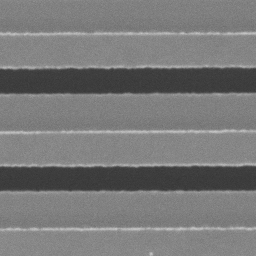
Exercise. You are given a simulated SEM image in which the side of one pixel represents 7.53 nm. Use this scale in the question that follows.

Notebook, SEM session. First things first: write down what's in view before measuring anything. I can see lines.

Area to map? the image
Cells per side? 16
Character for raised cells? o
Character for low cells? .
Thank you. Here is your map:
oooooooooooooooo
oooooooooooooooo
oooooooooooooooo
oooooooooooooooo
................
................
oooooooooooooooo
oooooooooooooooo
oooooooooooooooo
oooooooooooooooo
................
................
oooooooooooooooo
oooooooooooooooo
oooooooooooooooo
oooooooooooooooo